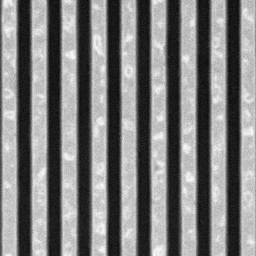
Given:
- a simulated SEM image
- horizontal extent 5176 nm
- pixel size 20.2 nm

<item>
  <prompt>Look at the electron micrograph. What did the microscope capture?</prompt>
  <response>parallel lines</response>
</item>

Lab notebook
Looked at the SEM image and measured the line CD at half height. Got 314 nanometers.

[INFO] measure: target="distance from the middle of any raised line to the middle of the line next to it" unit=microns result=0.604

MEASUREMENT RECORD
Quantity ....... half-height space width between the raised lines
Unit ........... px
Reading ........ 13.9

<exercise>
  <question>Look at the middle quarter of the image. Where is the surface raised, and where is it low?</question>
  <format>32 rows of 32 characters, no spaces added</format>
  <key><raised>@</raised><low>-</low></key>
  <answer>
@@@----@@@@---@@@@----@@@----@@@
@@@----@@@@---@@@@----@@@----@@@
@@@----@@@@---@@@@----@@@----@@@
@@@----@@@@---@@@@----@@@----@@@
@@@----@@@@---@@@@----@@@----@@@
@@@----@@@@---@@@@----@@@----@@@
@@@----@@@@---@@@@----@@@----@@@
@@@----@@@@---@@@@----@@@----@@@
@@@----@@@@---@@@@----@@@----@@@
@@@----@@@@----@@@----@@@----@@@
@@@----@@@@----@@@----@@@----@@@
@@@----@@@@---@@@@----@@@----@@@
@@@----@@@@---@@@@----@@@----@@@
@@@----@@@@---@@@@----@@@----@@@
@@@----@@@@---@@@@----@@@----@@@
@@@----@@@@---@@@@----@@@----@@@
@@@----@@@@---@@@@----@@@@---@@@
@@@----@@@@---@@@@----@@@@---@@@
@@@----@@@@---@@@@----@@@@---@@@
@@@----@@@@---@@@@----@@@@---@@@
@@@----@@@@---@@@@----@@@----@@@
@@@----@@@@---@@@@----@@@----@@@
@@@----@@@@---@@@@----@@@----@@@
@@@----@@@@---@@@@----@@@----@@@
@@@----@@@@---@@@@----@@@----@@@
@@@----@@@@---@@@@----@@@----@@@
@@@----@@@@---@@@@----@@@----@@@
@@@----@@@@---@@@@----@@@----@@@
@@@----@@@@---@@@@----@@@----@@@
@@@----@@@@---@@@@----@@@----@@@
@@@----@@@@---@@@@----@@@@---@@@
@@@----@@@@---@@@@----@@@----@@@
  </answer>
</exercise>